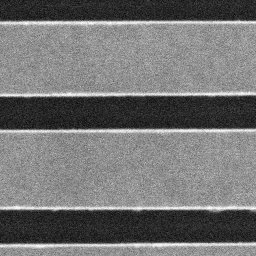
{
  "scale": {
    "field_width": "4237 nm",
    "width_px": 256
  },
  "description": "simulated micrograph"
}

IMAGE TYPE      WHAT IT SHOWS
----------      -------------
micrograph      lines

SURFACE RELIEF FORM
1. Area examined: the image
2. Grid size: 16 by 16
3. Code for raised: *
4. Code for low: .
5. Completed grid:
................
****************
****************
****************
****************
****************
................
................
****************
****************
****************
****************
****************
................
................
****************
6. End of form